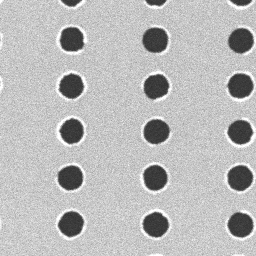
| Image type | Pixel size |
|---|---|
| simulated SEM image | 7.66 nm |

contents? a regular array of holes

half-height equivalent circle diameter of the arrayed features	198	nm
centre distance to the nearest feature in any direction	352	nanometers